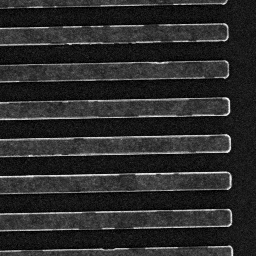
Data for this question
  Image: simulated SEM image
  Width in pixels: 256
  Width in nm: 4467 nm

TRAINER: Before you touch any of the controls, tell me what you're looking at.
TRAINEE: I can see parallel lines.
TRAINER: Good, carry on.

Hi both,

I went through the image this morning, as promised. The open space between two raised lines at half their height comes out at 338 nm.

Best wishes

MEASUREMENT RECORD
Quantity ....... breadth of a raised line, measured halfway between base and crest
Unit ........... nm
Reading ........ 308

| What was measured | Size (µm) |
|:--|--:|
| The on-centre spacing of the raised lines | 0.648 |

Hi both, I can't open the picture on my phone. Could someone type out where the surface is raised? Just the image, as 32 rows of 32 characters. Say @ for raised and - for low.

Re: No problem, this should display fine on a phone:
@@@@@@@@@@@@@@@@@@@@@@@@@-------
--------------------------------
--------------------------------
--@@@@@@@@@@@@@@@@@@@@@@@@@@----
@@@@@@@@@@@@@@@@@@@@@@@@@@@@----
@@@@@@@----@--------------------
--------------------------------
--------------------------------
@@@@@@@@@@@@@@@@@@@@@@@@@@@@@---
@@@@@@@@@@@@@@@@@@@@@@@@@@@@----
--------------------------------
--------------------------------
--------------@@@@@@@@@@@@@@----
@@@@@@@@@@@@@@@@@@@@@@@@@@@@@---
@@@@@@@@@@@@@@@@@@@---@---------
--------------------------------
--------------------------------
@@@@@@@@@@@@@@@@@@@@@@@@@@@@@---
@@@@@@@@@@@@@@@@@@@@@@@@@@@@@---
@@@@@@--------------------------
--------------------------------
--------------------------------
@@@@@@@@@@@@@@@@@@@@@@@@@@@@@---
@@@@@@@@@@@@@@@@@@@@@@@@@@@@@---
--------------------------------
--------------------------------
-------------@@@@@@@@@@@@@@@@---
@@@@@@@@@@@@@@@@@@@@@@@@@@@@@---
@@@@@@@@@@@@@@@@@@--------------
--------------------------------
--------------------------------
@@@@@@@@@@@@@@@@@@@@@@@@@@@@@---